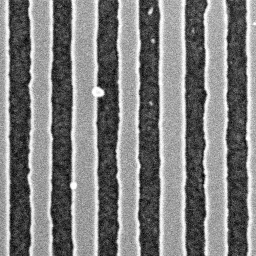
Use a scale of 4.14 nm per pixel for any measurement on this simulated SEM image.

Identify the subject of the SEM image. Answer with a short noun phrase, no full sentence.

lines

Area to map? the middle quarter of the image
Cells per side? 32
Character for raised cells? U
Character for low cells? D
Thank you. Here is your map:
DDUUUUUUDDDDDDUUUUUDDDDDUUUUUUDD
DDUUUUUUDDDDDDUUUUUDDDDDUUUUUUDD
DDUUUUUUDDDDDDUUUUUDDDDDUUUUUUDD
DDUUUUUUDDDDDDUUUUUDDDDDUUUUUUDD
DDUUUUUUDDDDDDUUUUUDDDDDUUUUUUDD
DDUUUUUUDDDDDDUUUUUDDDDDUUUUUUDD
DDUUUUUUUUDDDDUUUUUDDDDDUUUUUUDD
DDUUUUUUUUDDDDUUUUUDDDDDUUUUUUDD
DDUUUUUUDDDDDDUUUUUDDDDDUUUUUUDD
DDUUUUUUDDDDDDUUUUUDDDDDUUUUUUDD
DDUUUUUUDDDDDDUUUUUDDDDDUUUUUUDD
DDUUUUUUDDDDDDUUUUUDDDDDUUUUUUDD
DDUUUUUUDDDDDDUUUUUDDDDDUUUUUUDD
DDUUUUUUDDDDDDUUUUUDDDDDUUUUUUDD
DDUUUUUUDDDDDDUUUUUDDDDDUUUUUUDD
DDUUUUUUDDDDDDUUUUDDDDDDUUUUUUDD
DDUUUUUUDDDDDDUUUUUDDDDDUUUUUUDD
DDUUUUUUDDDDDDUUUUUDDDDDUUUUUUDD
DDUUUUUUDDDDDDUUUUUDDDDDUUUUUUDD
DDUUUUUUDDDDDUUUUUUDDDDDUUUUUUDD
DDUUUUUUDDDDDUUUUUUDDDDDUUUUUUDD
DDUUUUUUDDDDDUUUUUUDDDDDUUUUUUDD
DDUUUUUUDDDDDUUUUUUDDDDDUUUUUUDD
DDUUUUUUDDDDDUUUUUUDDDDDUUUUUUDD
DDUUUUUUDDDDDUUUUUUDDDDDUUUUUUDD
DDUUUUUUDDDDDUUUUUUDDDDDUUUUUUDD
DDUUUUUUDDDDDDUUUUUDDDDDUUUUUUDD
DDUUUUUUDDDDDUUUUUUDDDDDUUUUUUDD
DDUUUUUUDDDDDUUUUUUDDDDDUUUUUUDD
DDUUUUUUDDDDDDUUUUUDDDDDUUUUUUDD
DDUUUUUUDDDDDDUUUUUDDDDDUUUUUUDD
DDUUUUUUDDDDDDUUUUUDDDDDUUUUUUDD